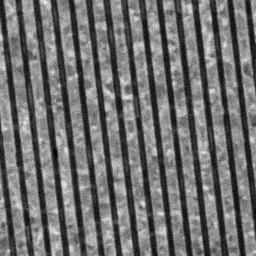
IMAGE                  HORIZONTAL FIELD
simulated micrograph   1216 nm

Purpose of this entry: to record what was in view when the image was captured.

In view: parallel lines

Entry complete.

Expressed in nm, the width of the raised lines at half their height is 47.1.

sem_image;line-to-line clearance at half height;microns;0.0365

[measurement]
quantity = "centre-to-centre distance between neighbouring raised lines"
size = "83.1 nm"